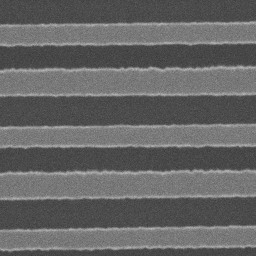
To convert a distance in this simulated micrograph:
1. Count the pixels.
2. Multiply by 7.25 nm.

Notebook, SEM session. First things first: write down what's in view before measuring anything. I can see lines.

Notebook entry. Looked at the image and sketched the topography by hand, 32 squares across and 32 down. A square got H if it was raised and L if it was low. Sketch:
LLLLLLLLLLLLLLLLLLLLLLLLLLLLLLLL
LLLLLLLLLLLLLLLLLLLLLLLLLLLLLLLL
LLLLLLLLLLLLLLLLLLLLLLLLLLLLLLLL
HHHHHHHHHHHHHHHHHHHHHHHHHHHHHHHH
HHHHHHHHHHHHHHHHHHHHHHHHHHHHHHHH
HHHHHHHHHHHHHHHHHHHHLLLHLLLLLLLL
LLLLLLLLLLLLLLLLLLLLLLLLLLLLLLLL
LLLLLLLLLLLLLLLLLLLLLLLLLLLLLLLL
LLLLLLLLLLLLLLLLLLLLLLLLLLHHHHHH
HHHHHHHHHHHHHHHHHHHHHHHHHHHHHHHH
HHHHHHHHHHHHHHHHHHHHHHHHHHHHHHHH
HHHHHHHHHHHHHHHHHHHHHHHHHHHHHHHH
LLLLLLLLLLLLLLLLLLLLLLLLLLLLLLLL
LLLLLLLLLLLLLLLLLLLLLLLLLLLLLLLL
LLLLLLLLLLLLLLLLLLLLLLLLLLLLLLLL
LLLLLLLLLLLLLLLLLLLLLLLLLLLLLLLL
HHHHHHHHHHHHHHHHHHHHHHHHHHHHHHHH
HHHHHHHHHHHHHHHHHHHHHHHHHHHHHHHH
LLLLLLLLLLLLLLLLLLLLLLLLLLLLLLLL
LLLLLLLLLLLLLLLLLLLLLLLLLLLLLLLL
LLLLLLLLLLLLLLLLLLLLLLLLLLLLLLLL
LLLLLLLLLLLLLLLLLLHLLHHHHHHHHHHH
HHHHHHHHHHHHHHHHHHHHHHHHHHHHHHHH
HHHHHHHHHHHHHHHHHHHHHHHHHHHHHHHH
HHHHHHHHHHHHHHHHHHHHHHHHHHHHHLHL
LLLLLLLLLLLLLLLLLLLLLLLLLLLLLLLL
LLLLLLLLLLLLLLLLLLLLLLLLLLLLLLLL
LLLLLLLLLLLLLLLLLLLLLLLLLLLLLLLL
LLLLLLLLLLLLLLLLLLLLLLLHHHHHHHHH
HHHHHHHHHHHHHHHHHHHHHHHHHHHHHHHH
HHHHHHHHHHHHHHHHHHHHHHHHHHHHHHHH
LLLLLLLLLLLLLLLLLLLLLLLLLLLLLLLL